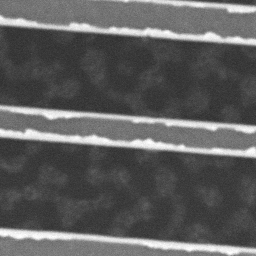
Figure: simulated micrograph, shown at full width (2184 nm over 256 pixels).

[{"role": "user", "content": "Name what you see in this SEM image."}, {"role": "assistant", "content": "one or a few lines or trenches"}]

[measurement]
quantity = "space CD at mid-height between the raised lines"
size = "768 nanometers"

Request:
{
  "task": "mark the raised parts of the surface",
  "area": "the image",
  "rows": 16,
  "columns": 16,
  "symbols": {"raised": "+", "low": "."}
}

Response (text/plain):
++++++++++++++++
.+++++++++++++++
.............+++
................
................
................
................
++++++++++......
++++++++++++++++
.............+++
................
................
................
................
+...............
++++++++++++++..